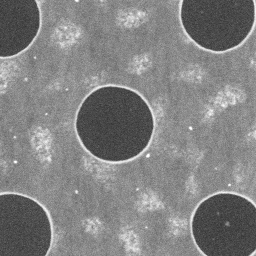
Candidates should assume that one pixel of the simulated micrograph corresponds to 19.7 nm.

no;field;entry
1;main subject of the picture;holes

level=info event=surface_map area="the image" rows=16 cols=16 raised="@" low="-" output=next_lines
--@@@@@@@@@-----
--@@@@@@@@@-----
--@@@@@@@@@@---@
-@@@@@@@@@@@@@@@
@@@@@@@@@@@@@@@@
@@@@@@--@@@@@@@@
@@@@@----@@@@@@@
@@@@@-----@@@@@@
@@@@@----@@@@@@@
@@@@@@---@@@@@@@
@@@@@@@@@@@@@@@@
@@@@@@@@@@@@@@@@
--@@@@@@@@@@@--@
---@@@@@@@@@----
---@@@@@@@@@----
---@@@@@@@@@----